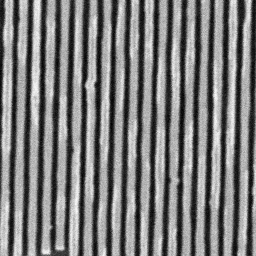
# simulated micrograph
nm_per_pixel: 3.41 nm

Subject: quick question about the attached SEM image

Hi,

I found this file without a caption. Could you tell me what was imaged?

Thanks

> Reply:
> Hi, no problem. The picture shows parallel lines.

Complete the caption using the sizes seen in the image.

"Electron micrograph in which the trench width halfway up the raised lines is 0.0222 microns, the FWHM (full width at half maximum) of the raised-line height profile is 25.6 nanometres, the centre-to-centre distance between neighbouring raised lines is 47.9 nanometers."